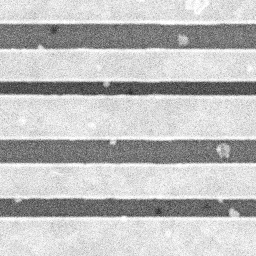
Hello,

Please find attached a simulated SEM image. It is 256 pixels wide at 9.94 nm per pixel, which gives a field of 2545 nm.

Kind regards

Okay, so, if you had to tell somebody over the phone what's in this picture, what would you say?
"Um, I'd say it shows lines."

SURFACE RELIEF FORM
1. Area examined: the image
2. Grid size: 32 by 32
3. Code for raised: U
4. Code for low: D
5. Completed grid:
UUUUUUUUUUUUUUUUUUUUUUUUUUUUUUUU
UUUUUUUUUUUUUUUUUUUUUUUUUUUUUUUU
UUUUUUUUUUUUUUUUUUUUUUUUUUUUUUUU
DDDDDDDDDDDDDDDDDDDDDDDDDDDDDDDD
DDDDDDDDDDDDDDDDDDDDDDDDDDDDDDDD
DDDDDDDDDDDDDDDDDDDDDDDDDDDDDDDD
UUUUUUUUUUUUUUUUUUUUUUUUUUUUUUUU
UUUUUUUUUUUUUUUUUUUUUUUUUUUUUUUU
UUUUUUUUUUUUUUUUUUUUUUUUUUUUUUUU
UUUUUUUUUUUUUUUUUUUUUUUUUUUUUUUU
DDDDDDDDDDDDDDDDDDDDDDDDDDDDDDDD
DDDDDDDDDDDDDDDDDDDDDDDDDDDDDDDD
UUUUUUUUUUUUUUUUUUUUUUUUUUUUUUUU
UUUUUUUUUUUUUUUUUUUUUUUUUUUUUUUU
UUUUUUUUUUUUUUUUUUUUUUUUUUUUUUUU
UUUUUUUUUUUUUUUUUUUUUUUUUUUUUUUU
UUUUUUUUUUUUUUUUUUUUUUUUUUUUUUUU
DDDDDDDDDDDDDDDDDDDDDDDDDDDDDDDD
DDDDDDDDDDDDDDDDDDDDDDDDDDDDDDDD
DDDDDDDDDDDDDDDDDDDDDDDDDDDDDDDD
DDDDDDDDDDDDDDDDDDDDDDDDDDDDDDDD
UUUUUUUUUUUUUUUUUUUUUUUUUUUUUUUU
UUUUUUUUUUUUUUUUUUUUUUUUUUUUUUUU
UUUUUUUUUUUUUUUUUUUUUUUUUUUUUUUU
UUUUUUUUUUUUUUUUUUUUUUUUUUUUUUUU
DDDDDDDDDDDDDDDDDDDDDDDDDDDDDDDD
DDDDDDDDDDDDDDDDDDDDDDDDDDDDDDDD
UUUUUUUUUUUUUUUUUUUUUUUUUUUUUUUU
UUUUUUUUUUUUUUUUUUUUUUUUUUUUUUUU
UUUUUUUUUUUUUUUUUUUUUUUUUUUUUUUU
UUUUUUUUUUUUUUUUUUUUUUUUUUUUUUUU
UUUUUUUUUUUUUUUUUUUUUUUUUUUUUUUU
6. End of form